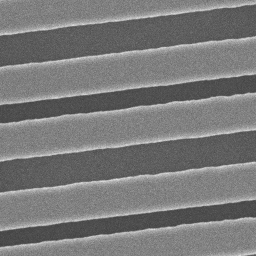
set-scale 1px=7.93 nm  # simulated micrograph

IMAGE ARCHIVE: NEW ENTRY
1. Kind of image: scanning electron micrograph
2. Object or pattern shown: lines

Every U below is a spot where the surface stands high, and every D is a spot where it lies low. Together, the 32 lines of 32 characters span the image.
UUUUUUUUUUUUUUUUUUUUUUUUUUUUUUUU
UUUUUUUUUUUUUUUUUUUUUUUUDDDDDDDD
UUUUUUUUUUUUUUUUDDDDDDDDDDDDDDDD
UUUUUUUDDDDDDDDDDDDDDDDDDDDDDDDD
DDDDDDDDDDDDDDDDDDDDDDDDDDDDDDDD
DDDDDDDDDDDDDDDDDDDDDDDDUUUUUUUU
DDDDDDDDDDDDDDDUUUUUUUUUUUUUUUUU
DDDDDDDUUUUUUUUUUUUUUUUUUUUUUUUU
UUUUUUUUUUUUUUUUUUUUUUUUUUUUUUUU
UUUUUUUUUUUUUUUUUUUUUUUUUUUUUUDD
UUUUUUUUUUUUUUUUUUUUUUDDDDDDDDDD
UUUUUUUUUUUUUUDDDDDDDDDDDDDDDDDD
UUUUUDDDDDDDDDDDDDDDDDDDDUUUUUUU
DDDDDDDDDDDDDDDDUUUUUUUUUUUUUUUU
DDDDDDDUUUUUUUUUUUUUUUUUUUUUUUUU
UUUUUUUUUUUUUUUUUUUUUUUUUUUUUUUU
UUUUUUUUUUUUUUUUUUUUUUUUUUUUUUDD
UUUUUUUUUUUUUUUUUUUUUDDDDDDDDDDD
UUUUUUUUUUUUUUDDDDDDDDDDDDDDDDDD
UUUUUUDDDDDDDDDDDDDDDDDDDDDDDDDD
DDDDDDDDDDDDDDDDDDDDDDDDDDDDDDUU
DDDDDDDDDDDDDDDDDDDDDDUUUUUUUUUU
DDDDDDDDDDDDDUUUUUUUUUUUUUUUUUUU
DDDDDUUUUUUUUUUUUUUUUUUUUUUUUUUU
UUUUUUUUUUUUUUUUUUUUUUUUUUUUUUUU
UUUUUUUUUUUUUUUUUUUUUUUUUUUUDDDD
UUUUUUUUUUUUUUUUUUUDDDDDDDDDDDDD
UUUUUUUUUUUDDDDDDDDDDDDDDDDDDUUU
UUUDDDDDDDDDDDDDDDDDUUUUUUUUUUUU
DDDDDDDDDDDDUUUUUUUUUUUUUUUUUUUU
DDDUUUUUUUUUUUUUUUUUUUUUUUUUUUUU
UUUUUUUUUUUUUUUUUUUUUUUUUUUUUUUU